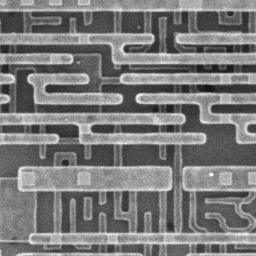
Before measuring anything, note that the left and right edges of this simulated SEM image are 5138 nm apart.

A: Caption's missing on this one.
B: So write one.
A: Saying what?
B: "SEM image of wiring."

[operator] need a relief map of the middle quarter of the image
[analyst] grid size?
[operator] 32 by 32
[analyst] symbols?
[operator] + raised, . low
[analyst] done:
................................
................................
................................
++++++........++++++++++++++++++
++++++........++++++++++++++++++
................................
................................
++++++++++++++.....+++++++++++++
+++++++++++++++...++++++++++++++
++++++++++++++....++++++++++++++
................................
................................
++++++++++++++++++..+++++++.....
++++++++++++++++++++++++++++++..
++++++++++++++++++++++++++++++..
....+++.........................
....+++.........................
....++++..............++++++++++
....++++++++++++++++++++++++++++
....++++++++++++++++++++++++++++
................................
................................
................................
................................
................................
................................
+++++++++++++++++++++++++++...++
+++++++++++++++++++++++++++...++
+++++++++++++++++++++++++++...++
+++++++++++++++++++++++++++...++
+++++++++++++++++++++++++++...++
++++++++++++++++++++++++++....++